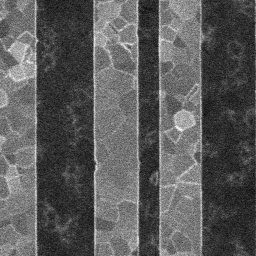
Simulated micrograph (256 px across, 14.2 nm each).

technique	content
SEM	one or a few lines or trenches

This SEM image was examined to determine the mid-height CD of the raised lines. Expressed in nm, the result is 604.